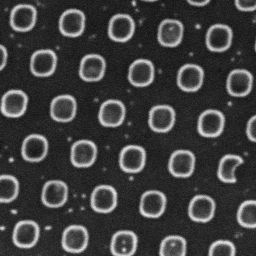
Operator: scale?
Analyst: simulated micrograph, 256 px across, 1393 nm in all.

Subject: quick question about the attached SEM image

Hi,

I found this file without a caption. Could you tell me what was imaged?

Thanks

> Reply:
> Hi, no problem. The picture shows a regular array of raised bodies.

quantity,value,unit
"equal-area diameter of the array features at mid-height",138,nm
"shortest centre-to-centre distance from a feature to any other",0.267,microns